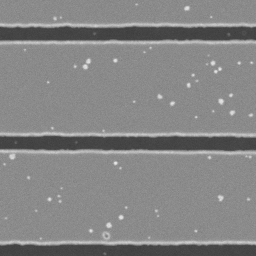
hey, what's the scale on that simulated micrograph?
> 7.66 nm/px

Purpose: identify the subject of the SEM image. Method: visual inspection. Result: lines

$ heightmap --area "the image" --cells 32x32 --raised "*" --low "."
********************************
********************************
********************************
................................
................................
********************************
********************************
********************************
********************************
********************************
********************************
********************************
********************************
********************************
********************************
********************************
********************************
................................
................................
********************************
********************************
********************************
********************************
********************************
********************************
********************************
********************************
********************************
********************************
********************************
****************************.***
................................